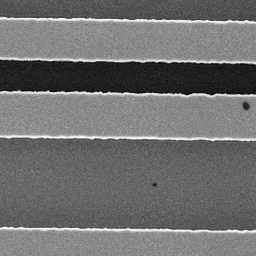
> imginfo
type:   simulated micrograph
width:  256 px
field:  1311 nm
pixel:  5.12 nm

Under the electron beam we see lines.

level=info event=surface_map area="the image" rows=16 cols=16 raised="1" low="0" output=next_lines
0000000000000000
1111111111111111
1111111111111111
1111111111111111
0000000000000000
0000000000000000
1111111111111111
1111111111111111
1111111111111111
0000000000000000
0000000000000000
0000000000000000
0000000000000000
0000000000000000
1111111111111111
1111111111111111